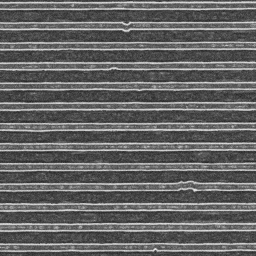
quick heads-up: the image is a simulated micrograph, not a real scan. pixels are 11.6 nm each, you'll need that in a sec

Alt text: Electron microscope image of parallel lines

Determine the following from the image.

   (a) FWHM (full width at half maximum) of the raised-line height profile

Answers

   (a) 7.62 pixels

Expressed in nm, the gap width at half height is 155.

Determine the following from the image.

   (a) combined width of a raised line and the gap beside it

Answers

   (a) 234 nanometers